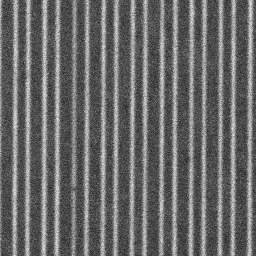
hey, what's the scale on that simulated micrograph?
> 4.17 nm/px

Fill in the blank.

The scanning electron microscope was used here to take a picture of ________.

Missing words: parallel lines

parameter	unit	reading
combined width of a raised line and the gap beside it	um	0.0612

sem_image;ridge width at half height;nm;12.5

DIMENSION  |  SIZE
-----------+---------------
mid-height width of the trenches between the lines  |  55.8 nm